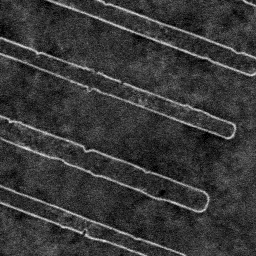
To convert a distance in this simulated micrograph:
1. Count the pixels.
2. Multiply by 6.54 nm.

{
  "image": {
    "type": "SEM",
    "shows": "one or a few lines or trenches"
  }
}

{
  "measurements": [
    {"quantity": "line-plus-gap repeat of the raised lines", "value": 460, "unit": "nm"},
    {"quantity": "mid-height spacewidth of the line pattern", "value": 336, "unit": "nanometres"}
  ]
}